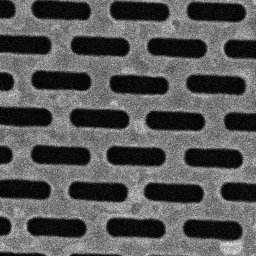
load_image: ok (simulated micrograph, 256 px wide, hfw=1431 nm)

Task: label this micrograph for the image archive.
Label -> a regular array of holes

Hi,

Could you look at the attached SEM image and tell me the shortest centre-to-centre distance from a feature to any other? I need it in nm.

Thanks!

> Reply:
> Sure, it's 292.